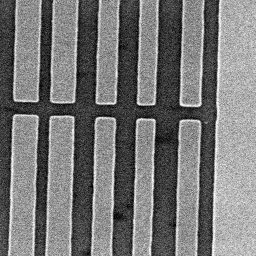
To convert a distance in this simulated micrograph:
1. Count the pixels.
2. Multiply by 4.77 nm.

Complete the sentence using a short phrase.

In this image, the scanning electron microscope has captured groups of lines, slits or small figures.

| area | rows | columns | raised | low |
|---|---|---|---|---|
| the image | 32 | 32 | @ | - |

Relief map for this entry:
--@@@--@@@--@@@---@@---@@--@@@@@
--@@@--@@@--@@@---@@---@@--@@@@@
--@@@--@@@--@@@---@@---@@--@@@@@
--@@@--@@@--@@@---@@---@@--@@@@@
--@@@--@@@--@@@---@@---@@--@@@@@
--@@@--@@@--@@@--@@@---@@--@@@@@
--@@@--@@---@@@--@@@---@@--@@@@@
--@@@--@@---@@@--@@@---@@--@@@@@
--@@@-@@@---@@@--@@@---@@--@@@@@
--@@@-@@@---@@@--@@@---@@--@@@@@
--@@@-@@@---@@@--@@----@@--@@@@@
--@@@-@@@---@@---@@----@@--@@@@@
--@@@--@@---@@---@@----@@--@@@@@
---------------------------@@@@@
--@@-----------------------@@@@@
--@@@-@@@---@@---@@----@@--@@@@@
--@@@-@@@---@@---@@---@@@--@@@@@
--@@@-@@@---@@---@@---@@@--@@@@@
--@@@-@@@---@@---@@---@@@--@@@@@
--@@--@@@---@@---@@---@@@--@@@@@
--@@--@@@---@@---@@---@@@--@@@@@
--@@--@@@---@@---@@---@@@--@@@@@
--@@--@@@---@@---@@---@@@--@@@@@
-@@@--@@@---@@---@@---@@@--@@@@@
-@@@--@@@---@@---@@---@@@--@@@@@
-@@@--@@@---@@---@@---@@@--@@@@@
-@@@--@@@---@@---@@---@@@--@@@@@
-@@@--@@@---@@---@@---@@@--@@@@@
-@@@--@@@---@@---@@---@@@--@@@@@
-@@@--@@@---@@---@@---@@@--@@@@@
-@@@--@@@---@@---@@---@@@--@@@@@
-@@@--@@@---@@---@@---@@@--@@@@@